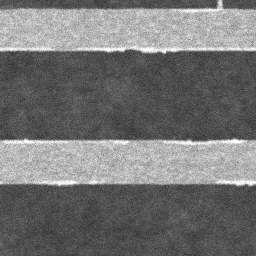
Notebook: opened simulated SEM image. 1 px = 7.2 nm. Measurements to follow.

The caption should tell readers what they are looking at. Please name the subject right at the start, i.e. one or a few lines or trenches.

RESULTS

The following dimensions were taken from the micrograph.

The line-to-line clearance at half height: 649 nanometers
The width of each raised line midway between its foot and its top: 301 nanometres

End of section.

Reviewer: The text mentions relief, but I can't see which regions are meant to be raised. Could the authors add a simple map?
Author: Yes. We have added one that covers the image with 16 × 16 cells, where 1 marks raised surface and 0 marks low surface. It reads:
1000000000000100
1111111111111111
1111111111111111
0000000000000000
0000000000000000
0000000000000000
0000000000000000
0000000000000000
0000000000000000
1111111111111111
1111111111111111
0001100000000011
0000000000000000
0000000000000000
0000000000000000
0000000000000000